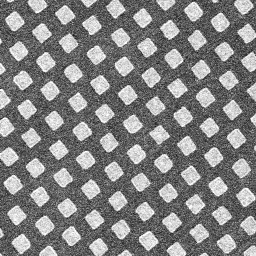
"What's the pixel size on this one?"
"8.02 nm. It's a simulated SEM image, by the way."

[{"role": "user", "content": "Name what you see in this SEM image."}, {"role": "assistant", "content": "a regular array of raised bodies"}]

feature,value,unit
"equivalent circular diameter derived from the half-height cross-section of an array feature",0.13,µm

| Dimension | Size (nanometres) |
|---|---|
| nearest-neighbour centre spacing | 231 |